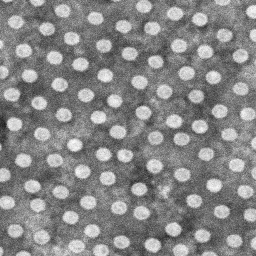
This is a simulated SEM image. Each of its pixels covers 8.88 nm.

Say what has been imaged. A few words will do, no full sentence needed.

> a regular array of raised bodies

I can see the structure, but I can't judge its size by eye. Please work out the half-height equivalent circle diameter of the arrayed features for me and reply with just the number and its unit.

114 nanometers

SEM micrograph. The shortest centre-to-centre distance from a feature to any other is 230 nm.